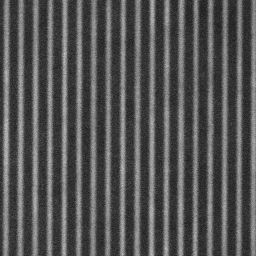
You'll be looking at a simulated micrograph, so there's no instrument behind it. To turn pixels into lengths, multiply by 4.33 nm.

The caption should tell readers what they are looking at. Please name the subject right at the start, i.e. parallel lines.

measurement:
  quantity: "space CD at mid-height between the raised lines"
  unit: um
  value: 0.046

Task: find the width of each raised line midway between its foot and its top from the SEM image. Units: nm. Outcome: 15.7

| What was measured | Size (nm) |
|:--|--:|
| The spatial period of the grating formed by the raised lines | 63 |